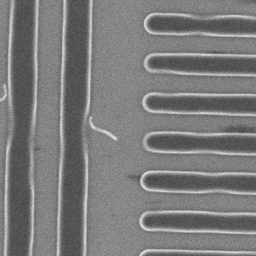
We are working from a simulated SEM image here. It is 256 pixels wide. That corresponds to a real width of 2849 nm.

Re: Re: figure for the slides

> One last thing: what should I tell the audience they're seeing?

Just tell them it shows groups of lines, slits or small figures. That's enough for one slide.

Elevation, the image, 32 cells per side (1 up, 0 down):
00111000111000000000000000000000
01111000111000000000000000000000
01111000111000000011111111111111
01111000111000000011111111111111
01111000111000000000000000000000
01111000111000000000000000000000
01110000111000000000000000000000
01110000111000000011111111111111
01111000111000000011111111111111
01111000111000000000000000000000
01111000111000000000000000000000
01110000111000000000000000000000
01110000111000000011111111111111
01110000111000000011111111111111
01110000111000000000000000000000
01110000111000000000000000000000
01110000111000000000000000000000
01110000111000000011111111111111
01110000111000000011111111111111
01110000111000000000000000000000
01110000111000000000000000000000
01110000111000000001111000000000
01110000111000000011111111111111
01110001111000000011111111111111
01110001111000000000000000000000
01110001111000000000000000000000
01110001111000000001111111000000
01110001111000000011111111111111
01110001111000000011111111111111
01110001111000000000000000000000
01110001111000000000000000000000
01110001111000000011111111111010